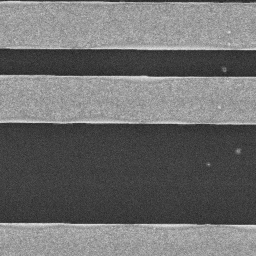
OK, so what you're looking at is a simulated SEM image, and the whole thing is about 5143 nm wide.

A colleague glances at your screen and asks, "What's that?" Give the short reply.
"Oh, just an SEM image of wiring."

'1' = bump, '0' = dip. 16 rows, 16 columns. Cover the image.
1111111111111111
1111111111111111
1111111111111111
0000000000000000
0000000000000000
1111111111111111
1111111111111111
1111111111111111
0000000000000000
0000000000000000
0000000000000000
0000000000000000
0000000000000000
0000000000000000
1111111111111111
1111111111111111